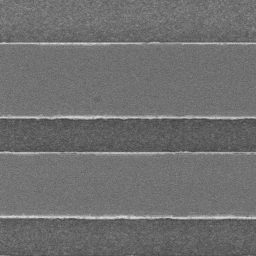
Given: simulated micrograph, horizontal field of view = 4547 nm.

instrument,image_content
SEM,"lines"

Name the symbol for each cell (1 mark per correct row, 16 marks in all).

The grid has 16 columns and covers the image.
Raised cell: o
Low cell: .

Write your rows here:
................
................
................
oooooooooooooooo
oooooooooooooooo
oooooooooooooooo
oooooooooooooooo
................
................
...........o....
oooooooooooooooo
oooooooooooooooo
oooooooooooooooo
oooooooooooooooo
................
................